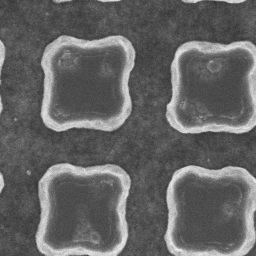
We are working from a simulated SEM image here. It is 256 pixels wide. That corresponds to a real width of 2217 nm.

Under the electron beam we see raised bodies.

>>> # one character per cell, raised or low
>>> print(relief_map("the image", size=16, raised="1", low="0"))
0000000000000000
0000000000000000
0000000000000000
0001111100011111
0001111100011111
0001111100011111
0001111100011111
0001111000011111
0000000000000000
0000000000000000
0000000000000000
0001111100011111
0001111100011111
0001111100011111
0001111100011111
0001111000011110